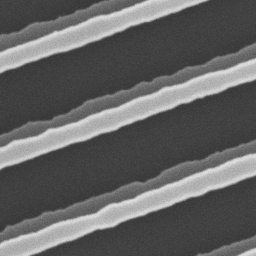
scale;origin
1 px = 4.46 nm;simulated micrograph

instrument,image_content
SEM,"lines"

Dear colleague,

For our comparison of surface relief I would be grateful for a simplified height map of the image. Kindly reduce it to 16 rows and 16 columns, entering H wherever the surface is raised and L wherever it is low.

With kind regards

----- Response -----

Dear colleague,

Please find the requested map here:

LLLLLHHHHHHHLLLL
LLHHHHHHHLLLLLLL
HHHHHHLLLLLLLLLL
HHHLLLLLLLLLLLHH
LLLLLLLLLLLHHHHH
LLLLLLLLHHHHHHLL
LLLLLHHHHHHLLLLL
LLLHHHHHHLLLLLLL
HHHHHHLLLLLLLLLL
HHHLLLLLLLLLLLHH
LLLLLLLLLLLHHHHH
LLLLLLLLHHHHHHHL
LLLLLHHHHHHLLLLL
LLLHHHHHHLLLLLLL
HHHHHHLLLLLLLLLL
HHHLLLLLLLLLLLHH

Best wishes